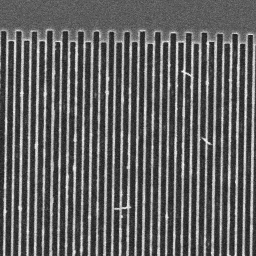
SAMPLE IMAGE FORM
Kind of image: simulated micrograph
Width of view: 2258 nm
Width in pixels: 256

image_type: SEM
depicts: parallel lines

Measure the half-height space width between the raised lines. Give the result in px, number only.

5.75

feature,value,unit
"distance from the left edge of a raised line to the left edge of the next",68.1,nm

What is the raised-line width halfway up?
15.4 nanometers